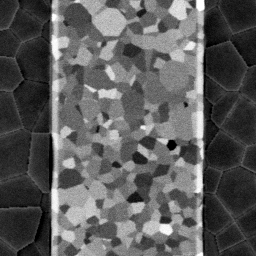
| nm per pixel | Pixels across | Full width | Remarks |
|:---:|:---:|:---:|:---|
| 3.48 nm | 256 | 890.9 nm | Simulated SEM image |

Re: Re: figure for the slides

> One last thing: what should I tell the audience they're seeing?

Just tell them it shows one or a few lines or trenches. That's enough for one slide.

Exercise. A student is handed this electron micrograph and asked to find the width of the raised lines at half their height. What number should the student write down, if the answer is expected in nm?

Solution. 506